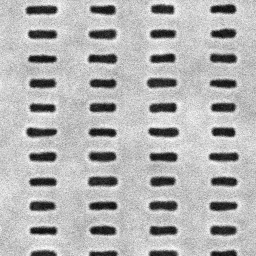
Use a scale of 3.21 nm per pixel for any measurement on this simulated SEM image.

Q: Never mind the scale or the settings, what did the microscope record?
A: a regular array of holes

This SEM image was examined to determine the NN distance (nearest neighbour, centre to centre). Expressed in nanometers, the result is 78.7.